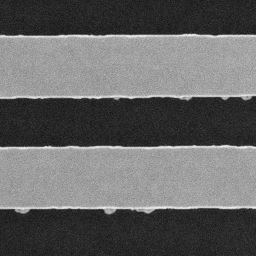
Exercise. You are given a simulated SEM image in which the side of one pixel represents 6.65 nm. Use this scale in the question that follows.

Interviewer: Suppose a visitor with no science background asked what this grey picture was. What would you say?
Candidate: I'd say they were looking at lines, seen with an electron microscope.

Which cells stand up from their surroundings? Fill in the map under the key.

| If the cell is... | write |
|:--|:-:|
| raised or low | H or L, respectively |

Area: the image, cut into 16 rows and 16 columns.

LLLLLLLLLLLLLLLL
LLLLLLLLLLLLLLLL
HHHHHHHHHHHHHHHH
HHHHHHHHHHHHHHHH
HHHHHHHHHHHHHHHH
HHHHHHHHHHHHHHHH
LLLLLLLLLLLLLLLL
LLLLLLLLLLLLLLLL
LLLLLLLLLLLLLLLL
HHHHHHHHHHHHHHHH
HHHHHHHHHHHHHHHH
HHHHHHHHHHHHHHHH
HHHHHHHHHHHHHHHH
LLLLLLLLLLLLLLLL
LLLLLLLLLLLLLLLL
LLLLLLLLLLLLLLLL